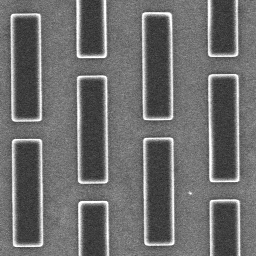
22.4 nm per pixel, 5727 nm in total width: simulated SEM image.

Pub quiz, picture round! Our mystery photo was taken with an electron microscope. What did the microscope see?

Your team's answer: groups of lines, slits or small figures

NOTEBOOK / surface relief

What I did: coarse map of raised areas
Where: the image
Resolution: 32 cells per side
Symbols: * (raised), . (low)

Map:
..........***.............****..
..........***.............****..
.****.....***.....***.....****..
.****.....***.....***.....****..
.****.....***.....***.....****..
.****.....***.....***.....****..
..***.....***.....***.....****..
..***.............****..........
..***.............****..........
..***.............****....***...
..***.....***.....****....****..
..***.....***.....****....****..
..***.....***.....****....****..
..***.....***.....****....****..
..***.....***.....****....****..
..........***.............****..
..........***.............****..
..***.....***.....***.....****..
..***.....***.....****....****..
..***.....***.....****....****..
..***.....***.....****....****..
..***.....***.....****....****..
..***.....***.....****.....***..
..***.............****..........
..***.............****..........
..***.....***.....****....****..
..***.....***.....****....****..
..***.....***.....****....****..
..***.....***.....****....****..
..***.....***.....****....****..
..***.....***.....***.....****..
..........****............****..